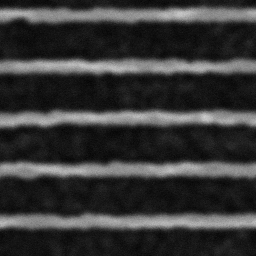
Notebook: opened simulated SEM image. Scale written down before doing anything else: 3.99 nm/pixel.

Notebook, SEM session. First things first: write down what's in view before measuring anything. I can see parallel lines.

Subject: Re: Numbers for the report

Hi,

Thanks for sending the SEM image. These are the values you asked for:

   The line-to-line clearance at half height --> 162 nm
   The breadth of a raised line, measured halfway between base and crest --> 11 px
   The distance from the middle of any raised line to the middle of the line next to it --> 206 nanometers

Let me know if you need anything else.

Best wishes